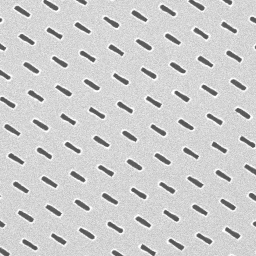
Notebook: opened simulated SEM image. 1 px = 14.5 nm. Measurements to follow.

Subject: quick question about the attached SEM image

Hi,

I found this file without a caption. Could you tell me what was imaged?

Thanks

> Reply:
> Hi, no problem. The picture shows a regular array of holes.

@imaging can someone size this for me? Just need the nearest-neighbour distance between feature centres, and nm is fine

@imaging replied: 414